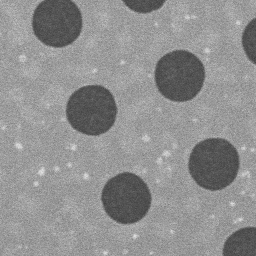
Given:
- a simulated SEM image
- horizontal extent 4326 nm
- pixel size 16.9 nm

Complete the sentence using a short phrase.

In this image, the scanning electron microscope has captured holes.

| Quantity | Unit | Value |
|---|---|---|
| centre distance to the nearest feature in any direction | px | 94.3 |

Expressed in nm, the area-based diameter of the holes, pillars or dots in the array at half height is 879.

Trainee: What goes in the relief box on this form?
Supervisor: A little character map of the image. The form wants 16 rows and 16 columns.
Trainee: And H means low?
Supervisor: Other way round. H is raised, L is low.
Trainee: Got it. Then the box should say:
HHLLLHHHLLHHHHHH
HHLLLHHHHHHHHHHL
HHLLLHHHHHHHHHHL
HHHHHHHHHHLLHHHL
HHHHHHHHHHLLLHHH
HHHHHLLHHHLLLHHH
HHHHLLLHHHHHHHHH
HHHHLLLHHHHHHHHH
HHHHHHHHHHHHHHHH
HHHHHHHHHHHHLLLH
HHHHHHHHHHHHLLLH
HHHHHHHLLHHHLLHH
HHHHHHLLLHHHHHHH
HHHHHHHLLHHHHHHH
HHHHHHHHHHHHHHHL
HHHHHHHHHHHHHHLL